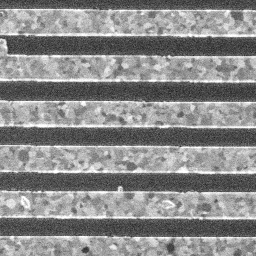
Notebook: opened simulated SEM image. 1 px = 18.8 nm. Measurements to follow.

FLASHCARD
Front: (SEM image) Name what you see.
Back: lines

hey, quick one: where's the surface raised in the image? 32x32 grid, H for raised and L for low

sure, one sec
LLLLLLLLLLLLLLLLLLLLLLLLLLLLLLLL
HHHHHHHHHHHHHHHHHHHHHHHHHHHHHHHH
HHHHHHHHHHHHHHHHHHHHHHHHHHHHHHHH
HHHHHHHHHHHHHHHHHHHHHHHHHHHHHHHH
LLLLLLLLLLLLLLLLLLLLLLLLLLLLLLLL
HLLLLLLLLLLLLLLLLLLLLLLLLLLLLLLL
HLLLLLLLLLLLLLLLLLLLLLLLLLLLLLLL
HHHHHHHHHHHHHHHHHHHHHHHHHHHHHHHH
HHHHHHHHHHHHHHHHHHHHHHHHHHHHHHHH
HHHHHHHHHHHHHHHHHHHHHHHHHHHHHHHH
LLLLLLLLLLLLLLLLLLLLLLLLLLLLLLLL
LLLLLLLLLLLLLLLLLLLLLLLLLLLLLLLL
LLLLLLLLLLLLLLLLLLLLLLLLLLLLLLLL
HHHHHHHHHHHHHHHHHHHHHHHHHHHHHHHH
HHHHHHHHHHHHHHHHHHHHHHHHHHHHHHHH
HHHHHHHHHHHHHHHHHHHHHHHHHHHHHHHH
LLLLLLLLLLLLLLLLLLLLLLLLLLLLLLLL
LLLLLLLLLLLLLLLLLLLLLLLLLLLLLLLL
HHHHHHHHHHHHHHHHHHHHHHHHHHHHHHHH
HHHHHHHHHHHHHHHHHHHHHHHHHHHHHHHH
HHHHHHHHHHHHHHHHHHHHHHHHHHHHHHHH
LLLLLLLLLLLHHHHHHHHHHHHHHHHHHHHH
LLLLLLLLLLLLLLLLLLLLLLLLLLLLLLLL
LLLLLLLLLLLLLLLLLLLLLLLLLLLLLLLL
HHHHHHHHHHHHHHHHHHHHHHHHHHHHHHHH
HHHHHHHHHHHHHHHHHHHHHHHHHHHHHHHH
HHHHHHHHHHHHHHHHHHHHHHHHHHHHHHHH
LLLLLLLLLLLLLLLLLLLLLLLLLLLLLLLL
LLLLLLLLLLLLLLLLLLLLLLLLLLLLLLLL
LLLLLLLLLLLLLLLLLLLLLLLLLLLLLLLL
HHHHHHHHHHHHHHHHHHHHHHHHHHHHHHHH
HHHHHHHHHHHHHHHHHHHHHHHHHHHHHHHH